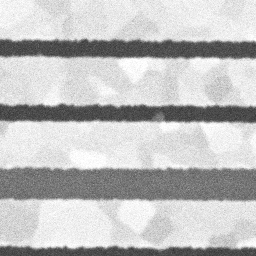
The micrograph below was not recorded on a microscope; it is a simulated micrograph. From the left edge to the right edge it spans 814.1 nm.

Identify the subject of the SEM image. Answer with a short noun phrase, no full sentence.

lines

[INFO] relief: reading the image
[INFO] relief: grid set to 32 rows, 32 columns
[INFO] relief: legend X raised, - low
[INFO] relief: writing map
XXXXXXXXXXXXXXXXXXXXXXXXXXXXXXXX
XXXXXXXXXXXXXXXXXXXXXXXXXXXXXXXX
XXXXXXXXXXXXXXXXXXXXXXXXXXXXXXXX
XXXXXXXXXXXXXXXXXXXXXXXXXXXXXXXX
XXXXXXXXXXXXXXXXXXXXXXXXXXXXXXXX
--------------------------------
--------------------------------
XXXXXXXXXXXXXXXXXXXXXXXXXXXXXXXX
XXXXXXXXXXXXXXXXXXXXXXXXXXXXXXXX
XXXXXXXXXXXXXXXXXXXXXXXXXXXXXXXX
XXXXXXXXXXXXXXXXXXXXXXXXXXXXXXXX
XXXXXXXXXXXXXXXXXXXXXXXXXXXXXXXX
XXXXXXXXXXXXXXXXXXXXXXXXXXXXXXXX
--------------------------------
--------------------------------
XXXXXXXXXXXXXXXXXXXXXXXXXXXXXXXX
XXXXXXXXXXXXXXXXXXXXXXXXXXXXXXXX
XXXXXXXXXXXXXXXXXXXXXXXXXXXXXXXX
XXXXXXXXXXXXXXXXXXXXXXXXXXXXXXXX
XXXXXXXXXXXXXXXXXXXXXXXXXXXXXXXX
XXXXXXXXXXXXXXXXXXXXXXXXXXXXXXXX
--------------------------------
--------------------------------
--------------------------------
--------------------------------
XXXXXXXXXXXXXXXXXXXXXXXXXXXXXXXX
XXXXXXXXXXXXXXXXXXXXXXXXXXXXXXXX
XXXXXXXXXXXXXXXXXXXXXXXXXXXXXXXX
XXXXXXXXXXXXXXXXXXXXXXXXXXXXXXXX
XXXXXXXXXXXXXXXXXXXXXXXXXXXXXXXX
XXXXXXXXXXXXXXXXXXXXXXXXXXXXXXXX
--------------------------------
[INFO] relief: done